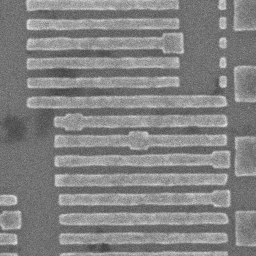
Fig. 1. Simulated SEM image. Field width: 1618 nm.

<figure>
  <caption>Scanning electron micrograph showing wiring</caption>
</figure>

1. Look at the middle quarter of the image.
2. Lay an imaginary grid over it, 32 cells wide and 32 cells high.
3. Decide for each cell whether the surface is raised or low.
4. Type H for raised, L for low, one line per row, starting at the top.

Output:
HHHHHHHHHHHHHHHHHHHHHHHHHHHHHLLL
LLLLLLLLLLLLLLLLLLLLLLLLLLLLLLLL
LLLLLLLLLLLLLLLLLLLLLLLLLLLLLLLL
LLLLLLLLHHHHHHHHHHHHHHHHHHHHLLLL
HHHHHHHHHHHHHHHHHHHHHHHHHHHHHLLL
HHHHHHHHHHHHHHHHHHHHHHHHHHHHLLLL
LLLLLLLLLLLLLLLLLLLLLLLLLLLLLLLL
LLLLLLLLLLLLLLLLLLLLLLLLLLLLLLLL
HHLLLHHHHHHHHHHHHHHHHHHHHHHHHHHH
HHHHHHHHHHHHHHHHHHHHHHHHHHHHHHHH
HHHHHHHHHHHHHHHHHHHHHHHHHHHHHHHH
LLLLLLLLLLLLLLLLLLLLLLLLLLLLLLLL
LLLLLLLLLLLLLLLLLLLLLLLLLLLLLLLL
HHHHHHHHHHHHHHHHHHHHHHHHHHHHHHHH
HHHHHHHHHHHHHHHHHHHHHHHHHHHHHHHH
HHHHHHHHHHHHHHHHHHHHLHHHHHHLLLLL
LLLLLLLLLLLLLLLLLLLLLLLLLLLLLLLL
LLLLLLLLLLLLLLLLHHHHHLLLLLLLLLLL
HHHHHHHHHHHHHHHHHHHHHHHHHHHHHHHH
HHHHHHHHHHHHHHHHHHHHHHHHHHHHHHHH
LLLLLLLLLLLLLLLLHHHHHLLLLLLLLLLL
LLLLLLLLLLLLLLLLLLLLLLLLLLLLLLLL
LLLLLLLLLLLLLLLLLLLLLLLLLLLLLLLL
HHHHHHHHHHHHHHHHHHHHHHHHHHHHHHHH
HHHHHHHHHHHHHHHHHHHHHHHHHHHHHHHH
HHHLLLLLLLLLLLLLLLLLLLLLLLLLLLLL
LLLLLLLLLLLLLLLLLLLLLLLLLLLLLLLL
LLLLLLLLLLLLLLLLLLLLLLLLLLLLLLLL
HHHHHHHHHHHHHHHHHHHHHHHHHHHHHHHH
HHHHHHHHHHHHLHHHHHHHHHHHHHHHHHHH
LLLLLLLLLLLLLLLLLLLLLLLLLLLLLLLL
LLLLLLLLLLLLLLLLLLLLLLLLLLLLLLLL